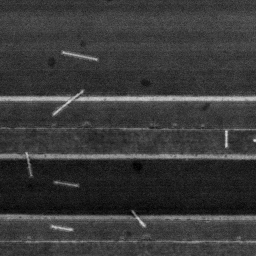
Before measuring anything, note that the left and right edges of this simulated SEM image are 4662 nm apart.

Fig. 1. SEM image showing lines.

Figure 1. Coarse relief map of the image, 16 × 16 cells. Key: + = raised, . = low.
................
................
................
................
................
................
++++++++++++++++
++++++++++++++++
++++++++++++++++
++++++++++++++++
................
................
................
................
++++++++++++++++
++++++++++++++++